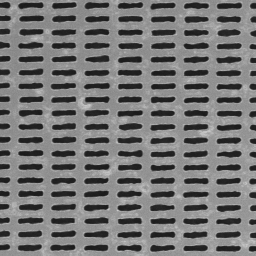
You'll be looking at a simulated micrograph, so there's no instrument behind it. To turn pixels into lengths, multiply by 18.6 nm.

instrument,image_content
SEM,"a regular array of holes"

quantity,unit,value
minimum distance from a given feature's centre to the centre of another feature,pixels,13.3